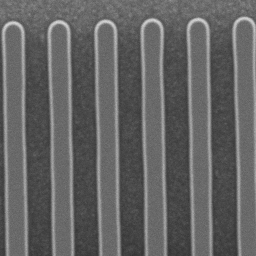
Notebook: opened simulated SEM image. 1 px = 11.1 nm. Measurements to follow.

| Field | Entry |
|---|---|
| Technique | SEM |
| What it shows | groups of lines, slits or small figures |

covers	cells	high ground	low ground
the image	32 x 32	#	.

................................
................................
........................#.....#.
.##...###...##....##....##...###
###...###...##....##....##...###
###...###...##....##....##...###
###...###...##....##....##...###
###...###...##....##....##...###
###...###...##....##....##...###
.##...###...###...##....##...###
.##...###...###...##....##...###
.##...###...###...##....##...###
.##...###...###...##....##...###
.##...###...###...##....##...###
.##...###...###...##....##...###
.##...###...###...##....##....##
.##...###...###...##....##....##
.##....##...###...##....##....##
.##...###...###...##....##....##
.##...###...###...###...##....##
.##....##...###...###...##....##
.##....##...###...###...##....##
.##....##...###...###...##....##
.##....##...###...###...##....##
.##....##...###...###...##....##
.##....##...###...###...##....##
.##....##...###...###...##....##
.##....##...###...###...##....##
.##....##....##...###...##....##
.##....##....##...###...##....##
.##....##....##...###...##....##
.##....##....##...###...##....##